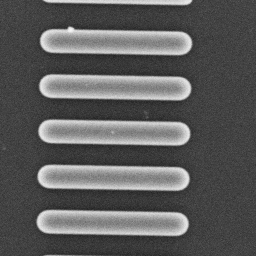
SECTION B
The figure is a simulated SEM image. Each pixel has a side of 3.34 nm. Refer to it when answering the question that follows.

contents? groups of lines, slits or small figures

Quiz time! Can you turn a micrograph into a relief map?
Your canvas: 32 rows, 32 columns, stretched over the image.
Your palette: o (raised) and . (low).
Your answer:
..................ooooo.........
................................
................................
................................
.....oooooooooooooooooo.........
.....ooooooooooooooooooo........
.......oooooooooooooooo.........
................................
................................
......oooooo....................
.....ooooooooooooooooooo........
.....ooooooooooooooooooo........
................................
................................
................................
.....oooooooooooooooooo.........
.....ooooooooooooooooooo........
.....oooooooooooooooooo.........
................................
................................
................................
.....oooooooooooooooooo.........
.....ooooooooooooooooooo........
..........ooooooooooooo.........
................................
................................
.....oooooooooo.................
.....oooooooooooooooooo.........
.....oooooooooooooooooo.........
................................
................................
................................